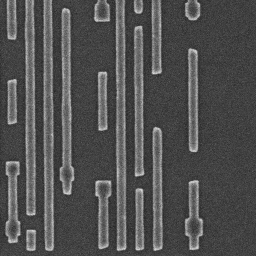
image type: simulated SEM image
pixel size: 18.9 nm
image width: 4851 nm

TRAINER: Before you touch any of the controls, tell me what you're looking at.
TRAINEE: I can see wiring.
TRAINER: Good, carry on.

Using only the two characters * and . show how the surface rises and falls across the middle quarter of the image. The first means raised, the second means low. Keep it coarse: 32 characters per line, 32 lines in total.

*............**...**..**.......*
*............**...**..**.......*
*........**..**...**...........*
*........**..**...**...........*
*........**..**...**...........*
*........*...**...**...........*
*........*...**...**...........*
*........*...**...**...........*
*........*...**...**...........*
*........*...**...**...........*
**.......**..**...**...........*
**.......**..**...**...........*
**.......**..**...**...........*
**.......**..**...**...........*
**.......**..**...**...........*
**.......**..**...**...........*
**...........**...**..**.......*
**...........**...**..**.......*
**...........**...**..**.......*
**...........**...**..**.......*
**...........**...**..**.......*
**...........**...**..**........
**...........**...**..**........
**...........**...**..**........
**...........**...**..**........
**...........**...**..**........
**...........**...**..**........
**...........**...**..**........
**...........**.......**........
**......***..**.......**........
**......****.**.......**.......*
**......****.**...**..**.......*